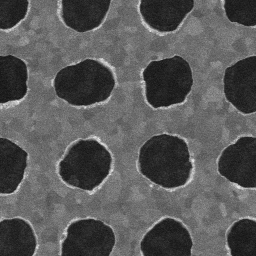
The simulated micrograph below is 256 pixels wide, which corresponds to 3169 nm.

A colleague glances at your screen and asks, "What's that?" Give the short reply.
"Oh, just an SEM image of holes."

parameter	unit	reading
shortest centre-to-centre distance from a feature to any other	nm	987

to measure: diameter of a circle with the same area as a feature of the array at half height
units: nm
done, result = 642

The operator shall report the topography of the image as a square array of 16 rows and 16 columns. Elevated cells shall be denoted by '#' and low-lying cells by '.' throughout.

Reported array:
..##...##...##..
.###..###..####.
################
.###############
..##...##...##..
..#....##...##..
####..###..###..
################
##########.#####
..##...##...##..
..##...##...##..
.###..####.####.
################
################
..##...##...##..
..##...##...##..